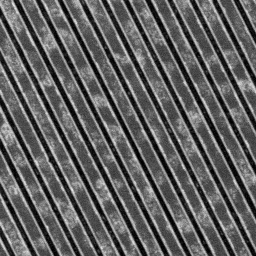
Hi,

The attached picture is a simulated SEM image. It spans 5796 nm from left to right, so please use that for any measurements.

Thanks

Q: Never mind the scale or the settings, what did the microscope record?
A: parallel lines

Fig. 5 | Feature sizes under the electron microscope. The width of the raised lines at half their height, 288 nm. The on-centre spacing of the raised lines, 445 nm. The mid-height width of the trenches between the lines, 0.154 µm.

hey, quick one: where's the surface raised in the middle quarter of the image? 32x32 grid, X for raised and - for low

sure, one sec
X--XXX--XXXX--XXX--XXXX--XXX--XX
X---XXX--XXX--XXXX--XXX--XXXX--X
XX--XXX--XXXX--XXX--XXXX--XXX--X
XX--XXXX--XXX--XXXX--XXX--XXXX--
XXX--XXX--XXXX--XXX--XXXX--XXX--
XXX--XXXX--XXX--XXXX--XXX--XXXX-
XXXX--XXX--XXXX--XXX--XXXX--XXX-
-XXX---XXX--XXX--XXXX--XXX--XXXX
-XXXX--XXX--XXXX--XXX--XXXX--XXX
--XXX---XXX--XXX--XXXX--XXX--XXX
--XXXX--XXX--XXXX--XXX--XXXX--XX
X--XXX--XXXX--XXX--XXXX--XXX--XX
X--XXXX--XXX--XXXX--XXX--XXXX--X
XX--XXX--XXXX--XXX--XXXX--XXX--X
XX--XXXX--XXX--XXXX--XXX--XXXX--
XXX--XXX--XXXX--XXX--XXXX--XXX--
XXX--XXXX--XXX--XXXX--XXX--XXXX-
XXXX--XXX--XXXX--XXX--XXXX--XXX-
-XXX--XXXX--XXX--XXXX--XXX--XXXX
-XXXX--XXX--XXXX--XXX--XXXX--XXX
--XXX--XXXX--XXX--XXXX--XXX--XXX
--XXXX--XXX--XXXX--XXX--XXXX--XX
X--XXX--XXXX--XXX--XXXX--XXX--XX
X--XXXX--XXX--XXXX--XXX---XXX--X
XX--XXX--XXXX--XXX--XXXX--XXX--X
XX--XXXX--XXX---XXX--XXX--XXXX--
XXX--XXX--XXXX--XXX--XXXX--XXX--
XXX--XXXX--XXX---XXX--XXX---XXX-
-XXX--XXX--XXXX--XXX--XXXX--XXX-
-XXX--XXXX--XXX---XXX--XXX---XXX
--XXX--XXX--XXXX--XXX--XXXX--XXX
--XXX--XXXX--XXX---XXX--XXX---XX